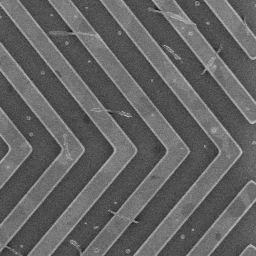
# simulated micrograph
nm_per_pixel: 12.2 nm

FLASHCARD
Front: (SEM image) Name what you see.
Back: groups of lines, slits or small figures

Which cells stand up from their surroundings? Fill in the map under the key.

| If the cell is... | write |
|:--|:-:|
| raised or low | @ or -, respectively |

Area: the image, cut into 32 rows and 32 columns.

@@@---@@@----@@@---@@@----@@@---
-@@----@@@----@@----@@@----@@---
--@@----@@@----@@----@@@----@@--
--@@@----@@@---@@@----@@@---@@@-
---@@@----@@----@@@----@@----@@@
----@@@---@@@----@@@---@@@----@@
@----@@----@@@----@@----@@@----@
@@----@@----@@@----@@----@@@----
@@@---@@@----@@----@@@----@@----
-@@----@@@----@@----@@@----@@---
-@@@----@@@---@@@----@@@---@@@--
--@@@----@@----@@@----@@----@@@-
---@@@----@@----@@@----@@----@@@
----@@----@@@----@@----@@@----@@
@----@@----@@@----@@----@@@----@
@@---@@@----@@@---@@@----@@@----
@@----@@@----@@----@@@----@@----
-@@----@@@----@@----@@@---@@@---
-@@@----@@----@@@----@@----@@@--
-@@----@@@----@@@----@@----@@@--
@@@---@@@----@@@----@@----@@@---
@@----@@----@@@----@@@----@@----
@----@@@---@@@----@@@----@@-----
----@@@----@@----@@@----@@@---@@
---@@@----@@----@@@----@@@----@@
--@@@----@@@----@@----@@@----@@@
-@@@----@@@----@@----@@@----@@@-
-@@----@@@----@@@----@@----@@@--
@@----@@@----@@@----@@----@@@---
@@----@@----@@@----@@@---@@@----
@----@@----@@@----@@@----@@-----
----@@@---@@@----@@@----@@----@@